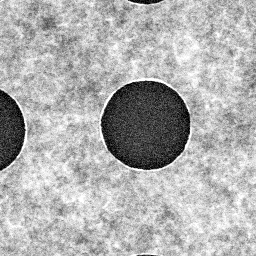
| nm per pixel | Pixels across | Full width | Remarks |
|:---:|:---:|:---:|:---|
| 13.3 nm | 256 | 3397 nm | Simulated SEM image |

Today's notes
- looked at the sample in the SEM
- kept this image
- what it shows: holes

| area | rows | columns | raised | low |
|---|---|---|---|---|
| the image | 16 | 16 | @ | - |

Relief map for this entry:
@@@@@@@@@@@@@@@@
@@@@@@@@@@@@@@@@
@@@@@@@@@@@@@@@@
@@@@@@@@@@@@@@@@
@@@@@@@@@@@@@@@@
@@@@@@@@---@@@@@
-@@@@@@-----@@@@
--@@@@------@@@@
--@@@@------@@@@
-@@@@@@----@@@@@
@@@@@@@@--@@@@@@
@@@@@@@@@@@@@@@@
@@@@@@@@@@@@@@@@
@@@@@@@@@@@@@@@@
@@@@@@@@@@@@@@@@
@@@@@@@@@@@@@@@@